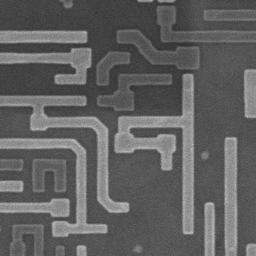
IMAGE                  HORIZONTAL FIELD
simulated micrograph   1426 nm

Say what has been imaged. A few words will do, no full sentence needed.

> wiring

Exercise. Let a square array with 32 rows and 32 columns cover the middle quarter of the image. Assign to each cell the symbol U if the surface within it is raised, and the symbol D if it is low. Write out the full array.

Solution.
DDUUUUDDUUUUDDDDDDDDDDDDDDDDUUUU
DDDUUDDDUUUDDDDDDDDDDDDDDDDDDDDD
DDDUUDDDUUUDDDDDDDDDDDDDDDDDDDDD
UUUUUDDDUUUDDDUUUUUUUUUUUUUDDDUU
UUUUUDDDUUUDDDUUUUUUUUUUUUUDDDUU
DDDDDDDDDDDDDDUUDDDDDDDDDDDDDDUU
DDDDDDDDDDDDDDUUDDDDDDDDDDDDDDUU
DDDDDDDDDDDDDUUUUDDDDDDDDDDDDDUU
UUUUUDDDUUUUUUUUUDDDDDDDDDDDDDUU
UUUUUDDDUUUUUUUUUDDDDDDDDDDDDDUU
DDDDDDDDDDDDUUUUUDDDDDDDDDDDDDUU
DDDDDDDDDDDDDDDDDDDDDDDDDDDDDDUU
DDDDDDDDDDDDDDDDDDDDDDDDDDDDDDUU
DDDDDDDDDDDDDDUUUUUUUUUUUUUUUUUU
UUUUUUUUUDDDDDUUUUUUUUUUUUUUUUUU
UUUUUUUUUUDDDDUUUUUUUUUUUUUUUUUU
DDDDDDDDUUUDDDUUDDDDDDDDDDDDDDUU
DDDDDDDDUUUDDUUUUDDDDDDDDDDDDDUU
DDDDDDDDDUUDDUUUUUDDDDDUUUUUDDUU
UUUDDDDDDUUDDUUUUUUUUUUUUUUUDDUU
UUUUDDDDDUUDDUUUUUUUUUUUUUUUDDUU
DDUUUDDDDUUDDUUUUDDDDDDDUUUUDDUU
DDDUUDDDDUUDDDDDDDDDDDDDUUUDDDUU
DDDUUDDDDUUDDDDDDDDDDDDDDUUDDDUU
DDDUUDDDDUUDDDDDDDDDDDDDDUUDDDUU
DDDUUDDDDUUDDDDDDDDDDDDDDUUDDDUU
DDDUUDDDDUUDDDDDDDDDDDDDDDDDDDUU
DDDUUDDDDUUDDDDDDDDDDDDDDDDDDDUU
DDDUUDDDDUUDDDDDDDDDDDDDDDDDDDUU
DDDUUDDDDUUDDDDDDDDDDDDDDDDDDDUU
DDDUUDDDDUUDDDDDDDDDDDDDDDDDDDUU
DDDUUDDDDUUDDDDDDDDDDDDDDDDDDDUU